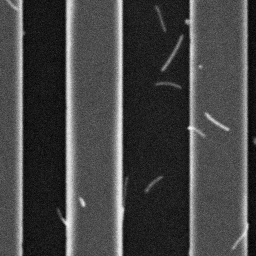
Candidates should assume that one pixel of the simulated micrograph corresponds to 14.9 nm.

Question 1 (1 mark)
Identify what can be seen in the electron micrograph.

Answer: lines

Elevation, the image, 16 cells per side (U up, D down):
UDDDUUUUDDDDUUUD
UDDDUUUUDDDDUUUD
UDDDUUUUDDDDUUUD
UDDDUUUUDDDDUUUD
UDDDUUUUDDDDUUUD
UDDDUUUUDDDDUUUD
UDDDUUUUDDDDUUUD
UDDDUUUUDDDDUUUD
UDDDUUUUDDDDUUUD
UDDDUUUUDDDDUUUD
UDDDUUUUDDDDUUUD
UDDDUUUUDDDDUUUD
UDDDUUUUDDDDUUUD
UDDDUUUUDDDDUUUD
UDDDUUUUDDDDUUUD
UDDDUUUUDDDDUUUD